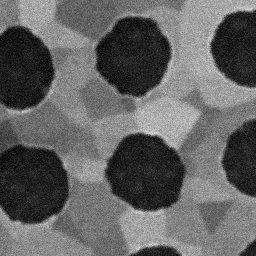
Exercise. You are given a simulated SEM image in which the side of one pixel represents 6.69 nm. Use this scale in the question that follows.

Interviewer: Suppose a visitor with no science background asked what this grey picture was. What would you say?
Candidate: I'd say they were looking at holes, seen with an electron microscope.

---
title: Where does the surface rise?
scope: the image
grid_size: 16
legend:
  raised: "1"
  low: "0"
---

1111111111111111
1111111000111100
0001110000011000
0001110000011000
0001110000111100
0001111000111110
0011111111111111
1111111111111111
1111111100111100
0001111000011100
0000111000001100
0000111000011100
0000111100011111
0001111111111111
1111111111111111
1111111110011110